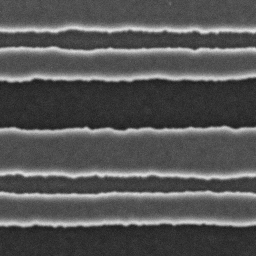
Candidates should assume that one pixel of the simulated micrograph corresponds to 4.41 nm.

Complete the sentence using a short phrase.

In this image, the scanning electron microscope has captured lines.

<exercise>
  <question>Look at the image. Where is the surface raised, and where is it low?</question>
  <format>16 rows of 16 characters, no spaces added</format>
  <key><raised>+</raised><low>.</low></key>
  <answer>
++++++++++++++++
++++++++++++++++
++++++++++++++++
++++++++++++++++
++++++++++++++++
................
................
................
++++++++++++++++
++++++++++++++++
++++++++++++++++
++++++++++++++++
++++++++++++++++
++++++++++++++++
................
................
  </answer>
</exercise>